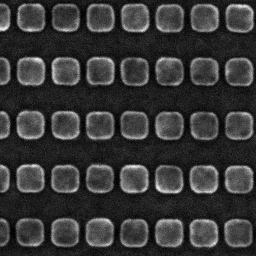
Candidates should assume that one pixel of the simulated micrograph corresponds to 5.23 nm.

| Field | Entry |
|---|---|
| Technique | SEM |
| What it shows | a regular array of raised bodies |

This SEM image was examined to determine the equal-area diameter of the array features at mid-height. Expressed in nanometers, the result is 151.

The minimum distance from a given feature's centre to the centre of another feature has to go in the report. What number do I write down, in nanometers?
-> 181